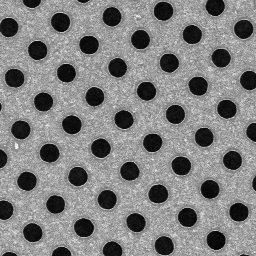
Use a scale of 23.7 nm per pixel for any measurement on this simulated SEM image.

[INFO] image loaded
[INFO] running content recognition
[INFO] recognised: a regular array of holes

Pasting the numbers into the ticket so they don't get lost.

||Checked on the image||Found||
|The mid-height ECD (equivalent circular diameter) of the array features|19.4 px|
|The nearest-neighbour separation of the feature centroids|857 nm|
